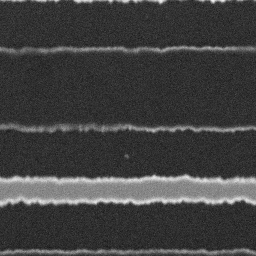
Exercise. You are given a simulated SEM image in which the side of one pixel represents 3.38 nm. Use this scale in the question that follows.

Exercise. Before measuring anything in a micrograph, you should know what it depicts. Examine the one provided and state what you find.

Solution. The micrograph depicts lines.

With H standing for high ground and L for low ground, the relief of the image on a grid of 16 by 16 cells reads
LLLLLLLLLLLLLLLL
LLLLLLLLLLLLLLLL
LLLLLLLLLLLLLLLL
HHHHHHHHHHHHHHHH
HHHHHHHHHHHHHHHH
HHHHHHHHHHHHHHHH
HHHHHHHHHHHHHHHH
HHHHHHHHHHHHHHHH
LLLLLLLLLLLLLLLL
LLLLLLLLLLLLLLLL
LLLLLLLLLLLLLLLL
HHHHHHHHHHHHHHHH
HHHHHHHHHHHHHHHH
LLLLLLLLLLLLLLLL
LLLLLLLLLLLLLLLL
LLLLLLLLLLLLLLLL